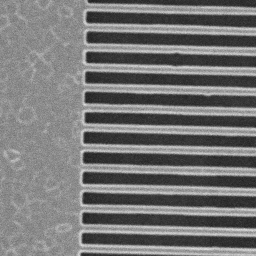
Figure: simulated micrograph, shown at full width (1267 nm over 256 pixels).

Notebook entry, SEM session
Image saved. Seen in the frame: parallel lines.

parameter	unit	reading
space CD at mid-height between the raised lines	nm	66.2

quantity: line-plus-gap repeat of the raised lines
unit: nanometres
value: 99.6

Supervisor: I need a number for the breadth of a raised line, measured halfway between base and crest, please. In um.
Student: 0.0334